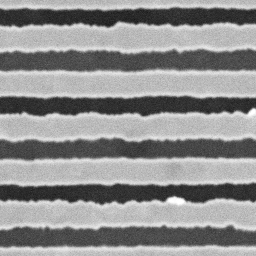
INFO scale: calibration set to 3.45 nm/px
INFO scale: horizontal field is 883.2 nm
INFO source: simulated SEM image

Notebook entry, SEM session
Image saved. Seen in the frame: lines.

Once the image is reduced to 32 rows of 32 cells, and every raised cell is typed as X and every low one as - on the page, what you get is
XXXXXXXXXXXXXXXXXXXXXXXXXXXXXXXX
--------------------------------
--------------------------------
XXXXXXXXXXXXXXXXXXXXXXXXXXXXXXXX
XXXXXXXXXXXXXXXXXXXXXXXXXXXXXXXX
XXXXXXXXXXXXXXXXXXXXXXXXXXXXXXXX
---------------XX---------------
--------------------------------
--------------------------------
XXXXXXXXXXXXXXXXXXXXXXXXXXXXXXXX
XXXXXXXXXXXXXXXXXXXXXXXXXXXXXXXX
XXXXXXXXXXXXXXXXXXXXXXXXXXXXXXXX
--------------------------------
--------------------------------
XXXX--XXXXXXXXXXXX-XXXXXXXXXXXXX
XXXXXXXXXXXXXXXXXXXXXXXXXXXXXXXX
XXXXXXXXXXXXXXXXXXXXXXXXXXXXXXXX
-XX--XXX--------XX--------------
--------------------------------
--------------------------------
XXXXXXXXXXXXXXXXXXXXXXXXXXXXXXXX
XXXXXXXXXXXXXXXXXXXXXXXXXXXXXXXX
XXXXXXXXXXXXXXXXXXXXXXXXXXXXXXXX
--------------------------------
--------------------------------
XXXXXXXXXXXX-XXXXXXXXXXXXXXXXXXX
XXXXXXXXXXXXXXXXXXXXXXXXXXXXXXXX
XXXXXXXXXXXXXXXXXXXXXXXXXXXXXXXX
X----------X------------------XX
--------------------------------
--------------------------------
XXXXXXXXXXXXXXXXXXXXXXXXXXXXXXXX